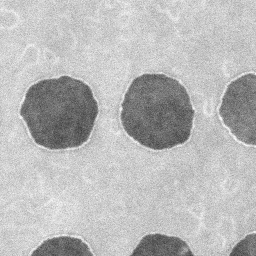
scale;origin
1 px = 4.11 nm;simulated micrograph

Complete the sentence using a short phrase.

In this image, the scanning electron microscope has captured raised bodies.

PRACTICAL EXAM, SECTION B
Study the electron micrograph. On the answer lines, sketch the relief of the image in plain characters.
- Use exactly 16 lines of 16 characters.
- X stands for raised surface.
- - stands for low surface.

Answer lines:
----------------
----------------
----------------
----------------
----------------
--XXXX--XXXX--XX
-XXXXX--XXXX--XX
-XXXXX--XXXX--XX
--XXXX--XXXX---X
----------------
----------------
----------------
----------------
----------------
----------------
--XXXX--XXXX---X